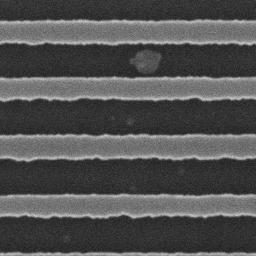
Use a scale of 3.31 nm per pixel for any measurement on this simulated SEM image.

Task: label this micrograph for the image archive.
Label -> lines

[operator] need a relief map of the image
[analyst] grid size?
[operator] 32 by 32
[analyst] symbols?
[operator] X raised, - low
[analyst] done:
--------------------------------
--------------------------------
--------------------------------
XXXXXXXXXXXXXXXXXXXXXXXXXXXXXXXX
XXXXXXXXXXXXXXXXXXXXXXXXXXXXXXXX
----X--------XX---------------XX
--------------------------------
--------------------------------
--------------------------------
--------------------------------
XXXXXXXXXXXXXXXXXXXXXXXXXXXXXXXX
XXXXXXXXXXXXXXXXXXXXXXXXXXXXXXXX
X--X----X----------X-----XX-----
--------------------------------
--------------------------------
--------------------------------
--------------------------------
XXXXXXXXXXXXXXXXXXXXXXXXXXXXXXXX
XXXXXXXXXXXXXXXXXXXXXXXXXXXXXXXX
XXXXXXXXXXXXXXXXXXXXXXXXXXXXXXXX
--------------------------------
--------------------------------
--------------------------------
--------------------------------
-XXXXXXXXXXXXXXXXXXXXXXX-XXXXXXX
XXXXXXXXXXXXXXXXXXXXXXXXXXXXXXXX
XXXXXXXXXXXXXXXXXXXXXXXXXXXXXXXX
--------------------------------
--------------------------------
--------------------------------
--------------------------------
--------------------------------